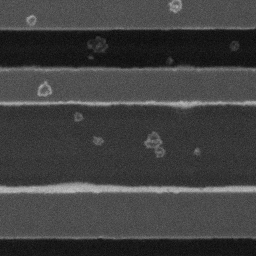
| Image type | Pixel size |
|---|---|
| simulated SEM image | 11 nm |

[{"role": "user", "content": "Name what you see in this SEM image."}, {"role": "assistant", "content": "lines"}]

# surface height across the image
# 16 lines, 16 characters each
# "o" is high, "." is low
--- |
oooooooooooooooo
oooooooooooooooo
................
................
oooooooooooooooo
oooooooooooooooo
................
................
................
................
................
................
oooooooooooooooo
oooooooooooooooo
oooooooooooooooo
................